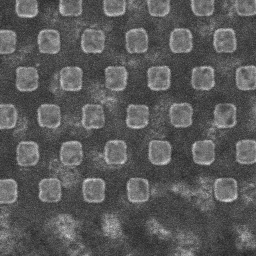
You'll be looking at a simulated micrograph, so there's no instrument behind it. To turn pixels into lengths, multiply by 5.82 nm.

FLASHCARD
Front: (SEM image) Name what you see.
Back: a regular array of raised bodies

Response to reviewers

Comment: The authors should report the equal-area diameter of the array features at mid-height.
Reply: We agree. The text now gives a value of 0.138 micrometres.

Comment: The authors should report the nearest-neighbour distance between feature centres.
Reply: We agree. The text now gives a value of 249 nm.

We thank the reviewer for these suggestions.